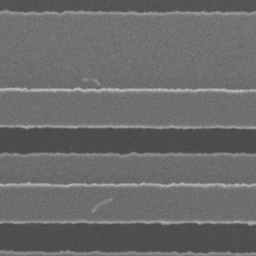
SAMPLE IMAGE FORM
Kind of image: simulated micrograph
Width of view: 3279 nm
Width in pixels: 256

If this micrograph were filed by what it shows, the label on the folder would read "lines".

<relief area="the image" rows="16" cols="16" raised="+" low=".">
................
++++++++++++++++
++++++++++++++++
++++++++++++++++
++++++++++++++++
++++++++++++++++
++++++++++++++++
++++++++++++++++
................
................
++++++++++++++++
++++++++++++++++
++++++++++++++++
++++++++++++++++
................
................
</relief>